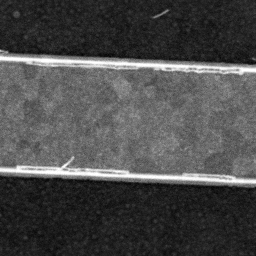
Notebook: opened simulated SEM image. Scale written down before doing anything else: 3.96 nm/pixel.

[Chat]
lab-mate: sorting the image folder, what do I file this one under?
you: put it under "one or a few lines or trenches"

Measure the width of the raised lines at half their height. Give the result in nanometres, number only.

445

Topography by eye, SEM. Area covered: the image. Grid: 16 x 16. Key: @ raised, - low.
----------------
----------------
----------------
----------------
@@@@@@@@@@@@@@@@
@@@@@@@@@@@@@@@@
@@@@@@@@@@@@@@@@
@@@@@@@@@@@@@@@@
@@@@@@@@@@@@@@@@
@@@@@@@@@@@@@@@@
@@@@@@@@@@@@@@@@
----------------
----------------
----------------
----------------
----------------